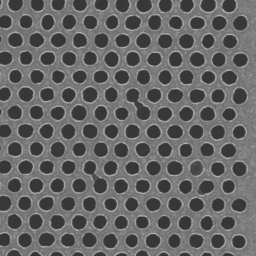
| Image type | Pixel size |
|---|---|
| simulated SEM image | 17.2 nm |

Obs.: a regular array of holes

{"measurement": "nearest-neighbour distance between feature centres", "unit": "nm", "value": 358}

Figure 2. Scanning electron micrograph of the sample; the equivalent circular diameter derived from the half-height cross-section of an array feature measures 241 nanometers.